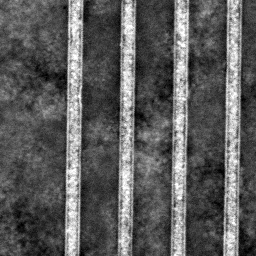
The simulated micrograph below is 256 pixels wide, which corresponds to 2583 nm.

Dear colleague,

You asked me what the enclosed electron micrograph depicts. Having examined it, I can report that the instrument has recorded parallel lines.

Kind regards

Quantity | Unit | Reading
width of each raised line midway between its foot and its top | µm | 0.125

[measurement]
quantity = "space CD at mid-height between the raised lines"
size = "410 nm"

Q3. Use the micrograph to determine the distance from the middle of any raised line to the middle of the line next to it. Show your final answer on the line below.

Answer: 0.534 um